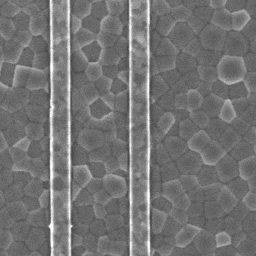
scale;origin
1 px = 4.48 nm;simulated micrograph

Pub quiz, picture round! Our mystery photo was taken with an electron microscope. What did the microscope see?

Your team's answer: one or a few lines or trenches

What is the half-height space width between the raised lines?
272 nm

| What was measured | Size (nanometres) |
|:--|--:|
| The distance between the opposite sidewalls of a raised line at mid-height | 84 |